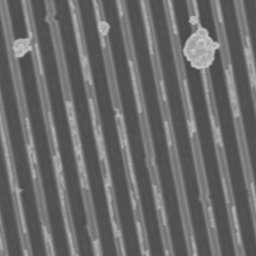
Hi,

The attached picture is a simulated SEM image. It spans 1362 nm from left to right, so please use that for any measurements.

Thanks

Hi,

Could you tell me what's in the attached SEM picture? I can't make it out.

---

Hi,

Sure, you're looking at parallel lines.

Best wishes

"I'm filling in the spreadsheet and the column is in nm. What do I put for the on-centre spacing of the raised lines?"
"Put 123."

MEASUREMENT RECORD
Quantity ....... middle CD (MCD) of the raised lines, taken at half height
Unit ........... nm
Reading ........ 56.2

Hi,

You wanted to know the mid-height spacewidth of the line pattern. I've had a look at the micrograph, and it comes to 67.2 nm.